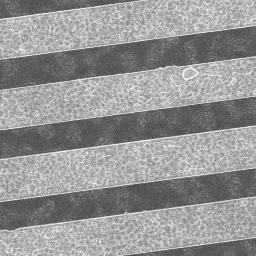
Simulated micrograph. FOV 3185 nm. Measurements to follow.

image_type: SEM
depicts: one or a few lines or trenches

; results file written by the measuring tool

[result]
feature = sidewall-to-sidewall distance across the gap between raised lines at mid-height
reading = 0.364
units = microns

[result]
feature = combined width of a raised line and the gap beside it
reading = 69.5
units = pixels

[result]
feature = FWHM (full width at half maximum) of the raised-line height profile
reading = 495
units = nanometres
